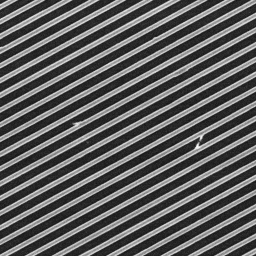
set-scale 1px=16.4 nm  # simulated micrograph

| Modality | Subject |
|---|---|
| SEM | parallel lines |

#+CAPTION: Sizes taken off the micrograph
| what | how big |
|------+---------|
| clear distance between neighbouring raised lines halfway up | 149 nanometres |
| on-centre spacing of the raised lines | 212 nanometres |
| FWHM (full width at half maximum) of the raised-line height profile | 73.8 nanometres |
